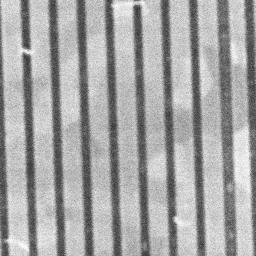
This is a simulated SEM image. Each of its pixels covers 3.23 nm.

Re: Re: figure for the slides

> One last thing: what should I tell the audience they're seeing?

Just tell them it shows parallel lines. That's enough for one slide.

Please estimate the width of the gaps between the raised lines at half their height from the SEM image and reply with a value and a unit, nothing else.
30.4 nm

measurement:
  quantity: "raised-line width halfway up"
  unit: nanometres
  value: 60.9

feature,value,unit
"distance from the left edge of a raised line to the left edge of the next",0.0911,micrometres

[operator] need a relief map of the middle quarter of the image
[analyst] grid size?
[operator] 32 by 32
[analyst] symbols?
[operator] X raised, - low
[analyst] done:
XXX---XXXX---XXXXX--XXXXX--XXXX-
XXXX--XXXX---XXXXX--XXXXX--XXXXX
XXX---XXXXX--XXXXX--XXXXX--XXXXX
XXX---XXXXX--XXXXX--XXXXX--XXXXX
XXXX--XXXXX--XXXXX--XXXXX--XXXXX
XXXX--XXXXX--XXXXX--XXXXX--XXXXX
XXXX--XXXXX--XXXXX--XXXXX--XXXXX
XXXX--XXXXX--XXXXX--XXXXX--XXXXX
XXXX--XXXXX--XXXXX--XXXXX--XXXXX
XXXX--XXXXX--XXXXX--XXXXX--XXXXX
XXXX--XXXXX--XXXXX--XXXXX--XXXXX
XXXX--XXXXX--XXXXX---XXXX--XXXXX
XXXX--XXXXX--XXXXX---XXXX--XXXXX
XXXX--XXXXX--XXXXX---XXXX--XXXXX
XXXX--XXXXX---XXXX---XXXX--XXXXX
XXXX--XXXXX---XXXX---XXXX---XXXX
XXXX---XXXX---XXXX---XXXX---XXXX
XXXX---XXXX---XXXX---XXXX---XXXX
XXXX---XXXX---XXXX---XXXX---XXXX
XXXX---XXXX---XXXX---XXXX---XXXX
XXXX---XXXX---XXXX---XXXX---XXXX
XXXX---XXXX---XXXX---XXXX---XXXX
XXXX---XXXX---XXXX---XXXX---XXXX
XXXX---XXXX---XXXX---XXXX---XXXX
XXXX---XXXX---XXXX---XXXX---XXXX
XXXX---XXXX---XXXX---XXXX---XXXX
XXXX---XXXX---XXXX---XXXXX--XXXX
XXXXX--XXXX---XXXX---XXXXX--XXXX
XXXX---XXXX---XXXXX--XXXXX--XXXX
XXXXX--XXXX---XXXXX--XXXXX--XXXX
XXXX---XXXX---XXXXX--XXXXX--XXXX
XXXX---XXXXX--XXXXX--XXXXX--XXXX